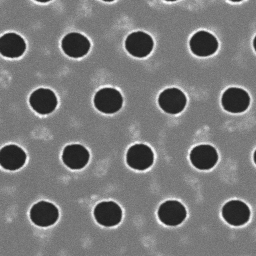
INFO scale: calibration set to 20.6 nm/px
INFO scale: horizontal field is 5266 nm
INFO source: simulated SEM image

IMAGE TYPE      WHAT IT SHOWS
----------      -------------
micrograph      a regular array of holes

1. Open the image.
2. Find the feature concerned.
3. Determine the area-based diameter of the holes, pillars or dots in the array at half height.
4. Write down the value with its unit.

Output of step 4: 573 nm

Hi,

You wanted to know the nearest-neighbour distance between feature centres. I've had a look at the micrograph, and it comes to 1310 nanometres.